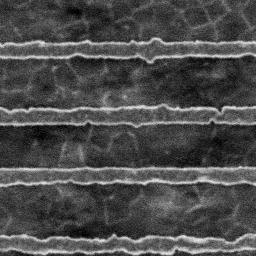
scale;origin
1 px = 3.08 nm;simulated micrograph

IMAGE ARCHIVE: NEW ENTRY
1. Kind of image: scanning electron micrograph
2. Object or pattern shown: one or a few lines or trenches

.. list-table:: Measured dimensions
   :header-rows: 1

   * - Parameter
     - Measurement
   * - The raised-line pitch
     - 64.9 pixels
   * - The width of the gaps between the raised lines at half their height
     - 158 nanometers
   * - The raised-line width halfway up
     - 45.8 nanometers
